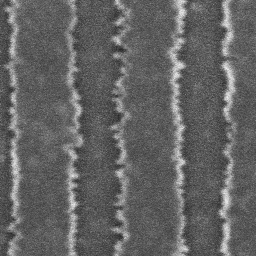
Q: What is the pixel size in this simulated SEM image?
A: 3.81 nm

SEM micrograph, one or a few lines or trenches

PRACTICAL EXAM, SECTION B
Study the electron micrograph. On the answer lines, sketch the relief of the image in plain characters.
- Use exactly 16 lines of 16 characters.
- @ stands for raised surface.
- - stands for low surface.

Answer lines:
-@@@@---@@@---@@
-@@@@---@@@---@@
-@@@---@@@@---@@
-@@@@---@@@---@@
-@@@----@@@---@@
-@@@@--@@@@---@@
-@@@@--@@@@---@@
-@@@@---@@@---@@
-@@@@--@@@@---@@
-@@@@---@@@---@@
-@@@----@@@---@@
-@@@----@@@---@@
-@@@@---@@@---@@
-@@@@---@@@---@@
-@@@----@@@---@@
-@@@@--@@@@---@@